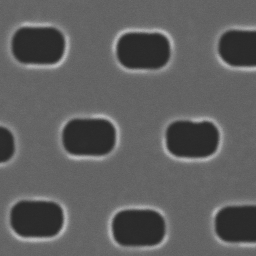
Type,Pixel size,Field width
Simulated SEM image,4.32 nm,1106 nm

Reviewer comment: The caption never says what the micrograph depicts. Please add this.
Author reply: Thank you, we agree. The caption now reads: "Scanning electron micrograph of holes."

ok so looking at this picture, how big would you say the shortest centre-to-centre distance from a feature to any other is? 436 nm